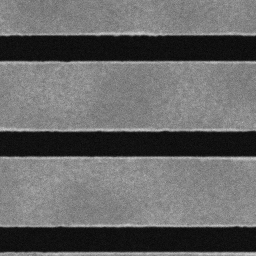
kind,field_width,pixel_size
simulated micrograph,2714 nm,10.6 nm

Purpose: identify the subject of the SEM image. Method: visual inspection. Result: lines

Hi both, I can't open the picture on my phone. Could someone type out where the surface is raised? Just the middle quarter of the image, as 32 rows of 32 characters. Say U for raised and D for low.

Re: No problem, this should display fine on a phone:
UUUUUUUUUUUUUUUUUUUUUUUUUUUUUUUU
UUUUUUUUUUUUUUUUUUUUUUUUUUUUUUUU
UUUUUUUUUUUUUUUUUUUUUUUUUUUUUUUU
UUUUUUUUUUUUUUUUUUUUUUUUUUUUUUUU
UUUUUUUUUUUUUUUUUUUUUUUUUUUUUUUU
UUUUUUUUUUUUUUUUUUUUUUUUUUUUUUUU
UUUUUUUUUUUUUUUUUUUUUUUUUUUUUUUU
UUUUUUUUUUUUUUUUUUUUUUUUUUUUUUUU
UUUUUUUUUUUUUUUUUUUUUUUUUUUUUUUU
UUUUUUUUUUUUUUUUUUUUUUUUUUUUUUUU
UUUUUUUUUUUUUUUUUUUUUUUUUUUUUUUU
UUUUUUUUUUUUUUUUUUUUUUUUUUUUUUUU
UUUUUUUUUUUUUUUUUUUUUUUUUUUUUUUU
UUUUUUUUUUUUUUUUUUUUUUUUUUUUUUUU
UUUUUUUUUUUUUUUUUUUUUUUUUUUUUUUU
UUUUUUUUUUUUUUUUUUUUUUUUUUUUUUUU
UUUUUUUUUUUUUUUUUUUUUUUUUUUUUUUU
DDDDDDDDDDDDDDDDDDDDDDDDDDDDDDDD
DDDDDDDDDDDDDDDDDDDDDDDDDDDDDDDD
DDDDDDDDDDDDDDDDDDDDDDDDDDDDDDDD
DDDDDDDDDDDDDDDDDDDDDDDDDDDDDDDD
DDDDDDDDDDDDDDDDDDDDDDDDDDDDDDDD
DDDDDDDDDDDDDDDDDDDDDDDDDDDDDDDD
UUUUUUUUUUUUDUUUUUUUUUUUUUUUUUUU
UUUUUUUUUUUUUUUUUUUUUUUUUUUUUUUU
UUUUUUUUUUUUUUUUUUUUUUUUUUUUUUUU
UUUUUUUUUUUUUUUUUUUUUUUUUUUUUUUU
UUUUUUUUUUUUUUUUUUUUUUUUUUUUUUUU
UUUUUUUUUUUUUUUUUUUUUUUUUUUUUUUU
UUUUUUUUUUUUUUUUUUUUUUUUUUUUUUUU
UUUUUUUUUUUUUUUUUUUUUUUUUUUUUUUU
UUUUUUUUUUUUUUUUUUUUUUUUUUUUUUUU